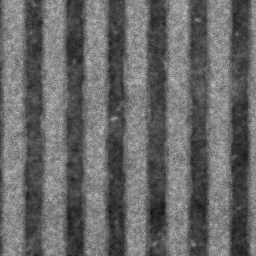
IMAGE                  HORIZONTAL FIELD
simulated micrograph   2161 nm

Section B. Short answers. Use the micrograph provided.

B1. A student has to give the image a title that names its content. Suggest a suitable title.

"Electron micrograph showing parallel lines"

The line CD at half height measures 142 nm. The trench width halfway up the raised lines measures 199 nm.